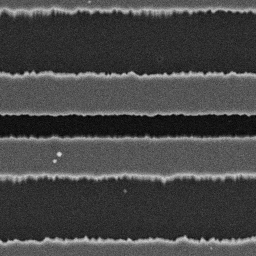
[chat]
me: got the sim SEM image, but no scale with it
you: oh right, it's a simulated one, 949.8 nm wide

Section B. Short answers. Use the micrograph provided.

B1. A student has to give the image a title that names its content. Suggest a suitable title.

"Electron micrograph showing lines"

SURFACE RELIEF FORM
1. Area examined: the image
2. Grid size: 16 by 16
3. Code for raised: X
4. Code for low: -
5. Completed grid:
XXXXXXXXXXXXXXXX
----------------
----------------
----------------
----------------
XXXXXXXXXXXXXXXX
XXXXXXXXXXXXXXXX
----------------
----------------
XXXXXXXXXXXXXXXX
XXXXXXXXXXXXXXXX
----------------
----------------
----------------
----------------
XXXXXXXXXXXXXXXX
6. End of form